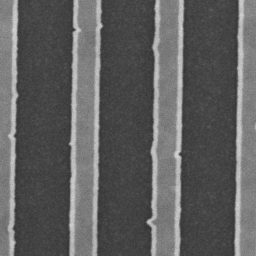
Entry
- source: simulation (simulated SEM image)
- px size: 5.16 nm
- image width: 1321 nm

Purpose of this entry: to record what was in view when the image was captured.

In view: one or a few lines or trenches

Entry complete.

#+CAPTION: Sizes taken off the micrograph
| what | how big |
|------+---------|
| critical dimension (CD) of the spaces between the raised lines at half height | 307 nm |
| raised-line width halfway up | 122 nm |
